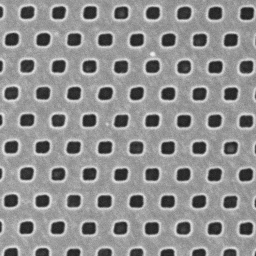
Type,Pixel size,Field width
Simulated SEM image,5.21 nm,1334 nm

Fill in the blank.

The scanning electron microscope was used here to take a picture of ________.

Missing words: a regular array of holes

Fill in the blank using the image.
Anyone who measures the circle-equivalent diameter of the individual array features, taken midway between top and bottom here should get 79.5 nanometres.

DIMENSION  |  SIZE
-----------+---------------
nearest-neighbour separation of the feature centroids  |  161 nanometers